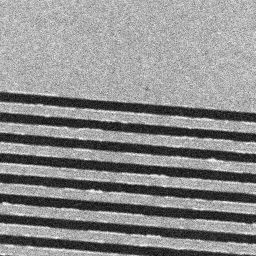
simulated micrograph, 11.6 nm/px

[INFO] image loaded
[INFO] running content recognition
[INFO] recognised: parallel lines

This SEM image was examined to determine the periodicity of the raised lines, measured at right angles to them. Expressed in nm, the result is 235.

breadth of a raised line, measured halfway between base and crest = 10.1 pixels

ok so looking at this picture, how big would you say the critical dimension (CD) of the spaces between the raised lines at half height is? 117 nm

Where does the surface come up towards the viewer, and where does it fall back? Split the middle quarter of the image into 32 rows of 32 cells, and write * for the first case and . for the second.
********************************
********************************
********************************
********************************
********************************
********************************
********************************
********************************
....****************************
...............*****************
............................****
********........................
********************............
...*****************************
..............******************
............................****
*********.......................
*******************.............
...*****************************
...............*****************
.........................*******
******..........................
******************..............
..****************************..
..............******************
..........................******
****............................
******************..............
..*************************..*..
..............******************
........................********
***...*.........................